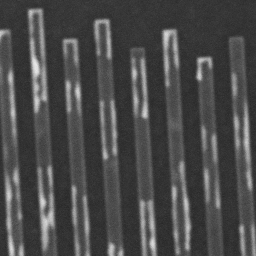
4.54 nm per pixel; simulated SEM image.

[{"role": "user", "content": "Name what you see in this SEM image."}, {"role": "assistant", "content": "parallel lines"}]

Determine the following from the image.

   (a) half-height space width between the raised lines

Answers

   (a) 87.9 nanometers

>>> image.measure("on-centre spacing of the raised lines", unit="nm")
151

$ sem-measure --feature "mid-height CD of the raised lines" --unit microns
0.0624